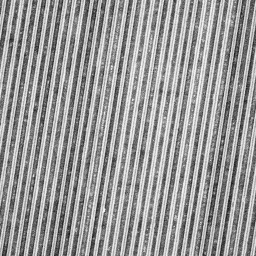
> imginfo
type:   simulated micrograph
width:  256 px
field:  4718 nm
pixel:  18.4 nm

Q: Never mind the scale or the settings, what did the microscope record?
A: parallel lines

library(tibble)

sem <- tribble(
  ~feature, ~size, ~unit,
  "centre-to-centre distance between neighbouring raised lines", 158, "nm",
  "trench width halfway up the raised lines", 114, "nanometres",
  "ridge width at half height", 0.0501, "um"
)